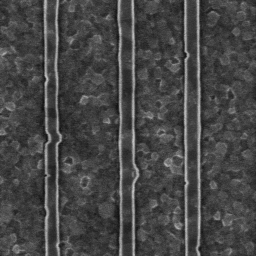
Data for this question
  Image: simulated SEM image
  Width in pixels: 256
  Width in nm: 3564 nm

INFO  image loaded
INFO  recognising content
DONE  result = one or a few lines or trenches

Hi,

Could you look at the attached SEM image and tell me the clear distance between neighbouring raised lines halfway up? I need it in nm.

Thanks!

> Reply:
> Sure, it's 777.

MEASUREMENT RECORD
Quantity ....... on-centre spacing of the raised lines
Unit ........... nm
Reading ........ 978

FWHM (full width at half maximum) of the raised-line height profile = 0.176 µm